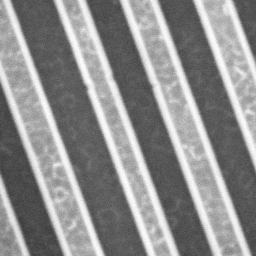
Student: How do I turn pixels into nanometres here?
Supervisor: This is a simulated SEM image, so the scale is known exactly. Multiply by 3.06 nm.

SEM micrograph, one or a few lines or trenches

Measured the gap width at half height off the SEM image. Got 122 nanometres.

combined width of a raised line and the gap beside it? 211 nanometers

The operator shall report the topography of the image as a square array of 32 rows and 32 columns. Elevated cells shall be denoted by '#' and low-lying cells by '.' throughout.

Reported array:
#......###......###......####...
#.......###.....####.....####...
##......###.....####......####..
##......####.....####.....####..
###......###.....####.....####..
###......###.....####......####.
###......####.....####.....####.
####......###.....####.....####.
####......###.....####......####
####.......###.....####.....####
.####......###.....####.....####
.####......###......###......###
.####.......###.....####.....###
..####......###.....####......##
..####......####.....####.....##
..#####......###.....####.....##
...####......###.....####......#
...####.......###.....####.....#
....####......###.....####.....#
....####......###......###......
....####.......###.....####.....
.....####......###.....####.....
.....####......####.....####....
.....#####......###.....####....
#.....####......###.....####....
#.....####......####.....####...
#.....#####......###.....####...
##.....####......###.....####...
##.....####.......###.....####..
##......####......###.....####..
###.....####......###......###..
###.....####.......###.....####.